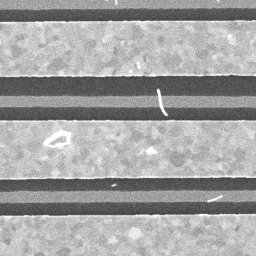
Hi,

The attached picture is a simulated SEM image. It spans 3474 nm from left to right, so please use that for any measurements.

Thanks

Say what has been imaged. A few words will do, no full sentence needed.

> lines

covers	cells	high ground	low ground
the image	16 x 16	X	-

----------------
XXXXXXXXXXXXXXXX
XXXXXXXXXXXXXXXX
XXXXXXXXXXXXXXXX
XXXXXXXXXXXXXXXX
----------------
----------------
----------------
XXXXXXXXXXXXXXXX
XXXXXXXXXXXXXXXX
XXXXXXXXXXXXXXXX
----------------
----------------
-XX-XXXXXXXXXXXX
XXXXXXXXXXXXXXXX
XXXXXXXXXXXXXXXX